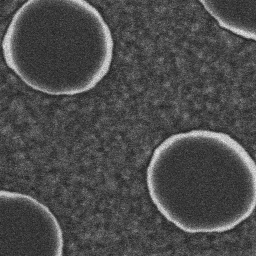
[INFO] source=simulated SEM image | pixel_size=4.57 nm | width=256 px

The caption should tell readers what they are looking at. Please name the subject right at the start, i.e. raised bodies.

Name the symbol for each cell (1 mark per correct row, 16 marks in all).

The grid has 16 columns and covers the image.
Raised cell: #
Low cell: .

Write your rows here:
.#####.......###
.#####........##
#######.........
.######.........
.#####..........
..###...........
................
................
...........###..
..........#####.
.........#######
.........#######
##........######
###.......#####.
####........#...
####............